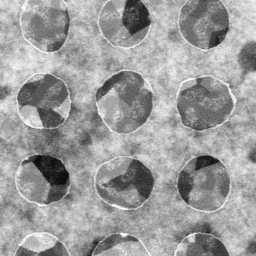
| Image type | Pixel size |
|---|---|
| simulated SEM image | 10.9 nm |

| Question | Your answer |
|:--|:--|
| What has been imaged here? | raised bodies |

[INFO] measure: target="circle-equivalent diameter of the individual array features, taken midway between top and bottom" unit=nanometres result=600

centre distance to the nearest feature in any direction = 864 nm